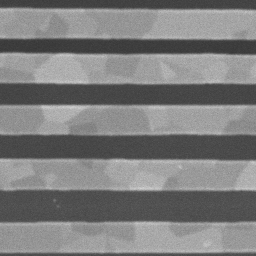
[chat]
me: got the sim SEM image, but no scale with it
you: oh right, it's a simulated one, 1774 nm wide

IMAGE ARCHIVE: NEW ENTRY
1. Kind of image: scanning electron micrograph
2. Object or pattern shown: lines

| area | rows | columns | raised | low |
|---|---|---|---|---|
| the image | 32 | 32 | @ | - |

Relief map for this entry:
--------------------------------
@@@@@@@@@@@@@@@@@@@@@@@@@@@@@@@@
@@@@@@@@@@@@@@@@@@@@@@@@@@@@@@@@
@@@@@@@@@@@@@@@@@@@@@@@@@@@@@@@@
@@@@@@@@@@@@@@@@@@@@@@@@@@@@@@@@
--------------------------------
--------------------------------
@@@@@@@@@@@@@@@@@@@@@@@@@@@@@@@@
@@@@@@@@@@@@@@@@@@@@@@@@@@@@@@@@
@@@@@@@@@@@@@@@@@@@@@@@@@@@@@@@@
--------------------------------
--------------------------------
--------------------------------
@@@@@@@@@@@@@@@@@@@@@@@@@@@@@@@@
@@@@@@@@@@@@@@@@@@@@@@@@@@@@@@@@
@@@@@@@@@@@@@@@@@@@@@@@@@@@@@@@@
@@@@@@@@@@@@@@@@@@@@@@@@@@@@@@@@
--------------------------------
--------------------------------
--------------------------------
@@@@@@@@@@@@@@@@@@@@@@@@@@@@@@@@
@@@@@@@@@@@@@@@@@@@@@@@@@@@@@@@@
@@@@@@@@@@@@@@@@@@@@@@@@@@@@@@@@
@@@@@@@@@@@@@@@@@@@@@@@@@@@@@@@@
--------------------------------
--------------------------------
--------------------------------
--------------------------------
@@@@@@@@@@@@@@@@@@@@@@@@@@@@@@@@
@@@@@@@@@@@@@@@@@@@@@@@@@@@@@@@@
@@@@@@@@@@@@@@@@@@@@@@@@@@@@@@@@
@@@@@@@@@@@@@@@@@@@@@@@@@@@-----